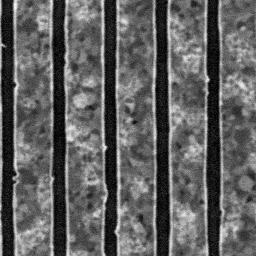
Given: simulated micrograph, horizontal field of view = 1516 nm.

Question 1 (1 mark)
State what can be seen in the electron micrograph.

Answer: parallel lines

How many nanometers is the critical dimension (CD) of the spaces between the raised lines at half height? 90.2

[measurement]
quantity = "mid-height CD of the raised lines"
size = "216 nm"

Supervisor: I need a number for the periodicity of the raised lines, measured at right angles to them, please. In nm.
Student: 305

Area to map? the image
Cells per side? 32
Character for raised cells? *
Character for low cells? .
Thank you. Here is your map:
..****..*****..****..*****..****
..****..*****..****..*****..****
..****..*****..****..*****..****
..****..*****..****..*****..****
..****..*****..****..*****..****
..****..*****..****..*****..****
..****..*****..****..*****..****
..****..*****..****..*****..****
..****..*****..****..*****..****
..****..*****..****..*****..****
..****..*****..****..*****..****
..****..*****..****..*****..****
..****..*****..****..*****..****
..****..*****..****..*****..****
..****..*****..****..*****..****
..****..*****..****..*****..****
..****..*****..****..*****..****
..****..*****..****..*****..****
..****..*****..****..*****..****
..****..*****..****..*****..****
..****..*****..****..*****..****
..****..*****..****..*****..****
..****..*****..****..*****..****
..****..*****..****..*****..****
..****..*****..****..*****..****
..****...****..****..*****..****
..****...****..****..*****..****
..****...****..****..*****..****
..****...****..****..*****..****
..****...****..****..*****..****
..****...****..****..*****..****
..*****..****..****..*****..****